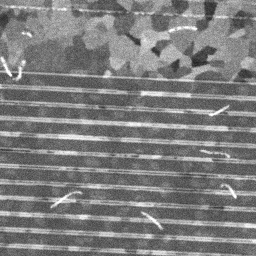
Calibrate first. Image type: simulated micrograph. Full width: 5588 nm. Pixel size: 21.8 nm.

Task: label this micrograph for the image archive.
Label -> parallel lines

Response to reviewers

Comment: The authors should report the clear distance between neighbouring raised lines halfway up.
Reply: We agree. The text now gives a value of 284 nanometres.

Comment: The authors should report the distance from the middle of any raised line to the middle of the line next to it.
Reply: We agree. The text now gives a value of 346 nm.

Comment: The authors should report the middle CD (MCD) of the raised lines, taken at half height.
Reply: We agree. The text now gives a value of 60 nm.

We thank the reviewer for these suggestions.